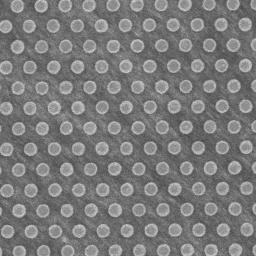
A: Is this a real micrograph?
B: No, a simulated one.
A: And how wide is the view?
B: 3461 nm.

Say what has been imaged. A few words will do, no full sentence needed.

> a regular array of raised bodies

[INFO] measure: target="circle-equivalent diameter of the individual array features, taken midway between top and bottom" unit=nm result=164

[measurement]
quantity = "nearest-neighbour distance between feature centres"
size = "319 nm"